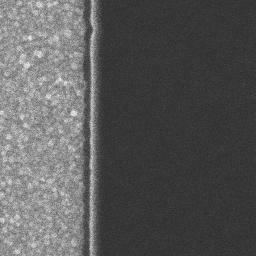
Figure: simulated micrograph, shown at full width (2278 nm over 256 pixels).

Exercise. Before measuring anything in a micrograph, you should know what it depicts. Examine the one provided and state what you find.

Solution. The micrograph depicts one or a few lines or trenches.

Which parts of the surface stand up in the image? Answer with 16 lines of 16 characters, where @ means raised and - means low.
------@@@@@@@@@@
------@@@@@@@@@@
------@@@@@@@@@@
------@@@@@@@@@@
------@@@@@@@@@@
------@@@@@@@@@@
------@@@@@@@@@@
------@@@@@@@@@@
------@@@@@@@@@@
------@@@@@@@@@@
------@@@@@@@@@@
------@@@@@@@@@@
------@@@@@@@@@@
------@@@@@@@@@@
------@@@@@@@@@@
------@@@@@@@@@@